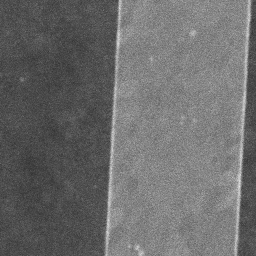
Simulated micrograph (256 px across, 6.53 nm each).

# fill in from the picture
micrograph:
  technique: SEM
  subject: one or a few lines or trenches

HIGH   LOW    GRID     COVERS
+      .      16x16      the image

.......+++++++++
.......+++++++++
.......+++++++++
.......++++++++.
.......++++++++.
.......++++++++.
.......++++++++.
.......++++++++.
.......++++++++.
.......++++++++.
.......++++++++.
.......++++++++.
.......++++++++.
.......++++++++.
.......++++++++.
.......++++++++.